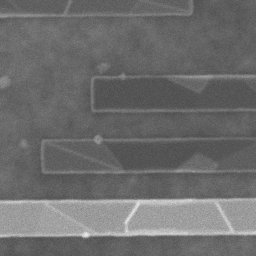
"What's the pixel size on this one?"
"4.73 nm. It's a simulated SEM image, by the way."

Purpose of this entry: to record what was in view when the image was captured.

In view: wiring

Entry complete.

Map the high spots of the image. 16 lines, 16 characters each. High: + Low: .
++++++++++++....
................
................
................
................
......++++++++++
......++++++++++
................
................
...+++++++++++++
...+++++++++++++
................
..............++
++++++++++++++++
++++++++++++++++
................